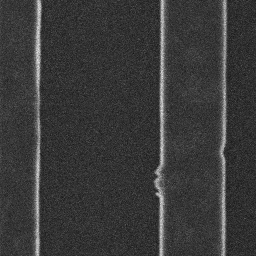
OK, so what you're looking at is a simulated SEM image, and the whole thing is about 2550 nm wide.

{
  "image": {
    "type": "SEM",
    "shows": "one or a few lines or trenches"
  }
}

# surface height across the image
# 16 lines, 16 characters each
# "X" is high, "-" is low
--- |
XX--------XXXX--
XX--------XXXX--
XX--------XXXX--
XX--------XXXX--
XX--------XXXX--
XX--------XXXX--
XX--------XXXX--
XX--------XXXX--
XX--------XXXX--
XX--------XXXX--
XX--------XXXX--
XX--------XXXX--
XX--------XXXX--
XX--------XXXX--
XX--------XXXX--
XX--------XXXX--